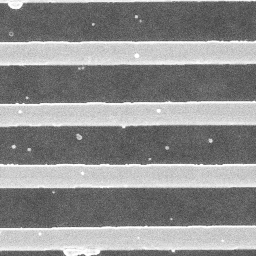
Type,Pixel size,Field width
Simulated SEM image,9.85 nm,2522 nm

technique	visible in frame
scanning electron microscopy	lines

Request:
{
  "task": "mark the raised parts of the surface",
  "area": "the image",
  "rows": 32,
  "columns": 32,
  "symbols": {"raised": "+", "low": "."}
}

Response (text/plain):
.++.............................
................................
................................
................................
................................
++++++++++++++++++++++++++++++++
++++++++++++++++++++++++++++++++
++++++++++++++++++++++++++++++++
................................
................................
................................
................................
................................
++++++++++++++++++++++++++++++++
++++++++++++++++++++++++++++++++
++..............................
................................
................................
................................
................................
................................
++++++++++++++++++++++++++++++++
++++++++++++++++++++++++++++++++
................................
................................
................................
................................
................................
............++++++++++++++++++++
++++++++++++++++++++++++++++++++
++++++++++++++++++++++++++++++++
........++.+....................